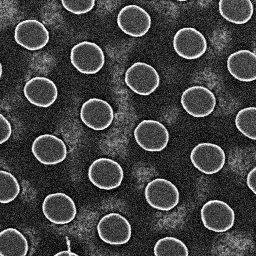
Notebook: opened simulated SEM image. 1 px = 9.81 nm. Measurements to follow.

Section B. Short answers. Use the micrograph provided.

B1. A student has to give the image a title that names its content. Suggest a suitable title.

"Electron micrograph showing a regular array of raised bodies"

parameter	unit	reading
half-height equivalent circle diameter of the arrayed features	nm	311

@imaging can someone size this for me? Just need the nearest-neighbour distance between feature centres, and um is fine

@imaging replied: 0.566